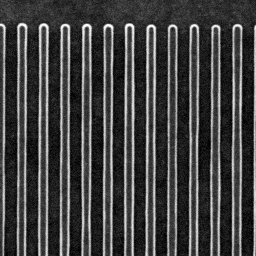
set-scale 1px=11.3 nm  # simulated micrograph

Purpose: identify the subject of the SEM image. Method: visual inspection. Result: parallel lines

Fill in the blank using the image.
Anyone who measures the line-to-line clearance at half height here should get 155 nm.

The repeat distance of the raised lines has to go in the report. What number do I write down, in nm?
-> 243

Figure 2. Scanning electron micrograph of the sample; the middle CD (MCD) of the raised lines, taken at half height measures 93.3 nm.